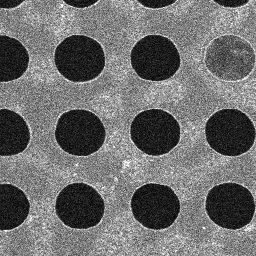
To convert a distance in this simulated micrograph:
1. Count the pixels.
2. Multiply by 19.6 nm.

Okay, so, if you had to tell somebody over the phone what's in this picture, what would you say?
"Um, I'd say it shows holes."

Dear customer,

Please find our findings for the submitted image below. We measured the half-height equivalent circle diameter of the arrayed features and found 48.3 px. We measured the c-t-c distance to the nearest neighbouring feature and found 1450 nm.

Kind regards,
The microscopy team